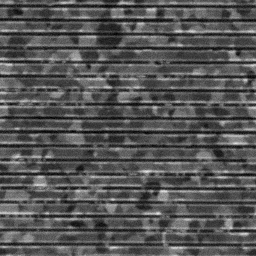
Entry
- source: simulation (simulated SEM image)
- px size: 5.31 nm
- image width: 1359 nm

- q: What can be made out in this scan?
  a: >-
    parallel lines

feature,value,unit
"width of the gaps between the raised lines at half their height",0.0252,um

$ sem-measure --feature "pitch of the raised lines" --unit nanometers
74.4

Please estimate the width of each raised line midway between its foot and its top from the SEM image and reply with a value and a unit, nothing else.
49.8 nanometres